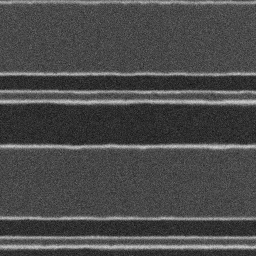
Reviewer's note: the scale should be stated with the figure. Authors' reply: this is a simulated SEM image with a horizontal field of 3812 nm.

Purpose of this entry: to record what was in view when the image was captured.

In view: lines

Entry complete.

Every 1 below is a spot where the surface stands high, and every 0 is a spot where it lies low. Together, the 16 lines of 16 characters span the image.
1111111111111111
1111111111111111
1111111111111111
1111111111111111
1111111111111111
1111111111111111
0000000000000000
0000000000000000
0000000000000000
1111111111111111
1111111111111111
1111111111111111
1111111111111111
1111111111111111
1111111111111111
0000000000000000